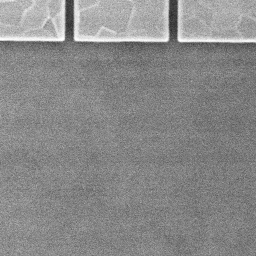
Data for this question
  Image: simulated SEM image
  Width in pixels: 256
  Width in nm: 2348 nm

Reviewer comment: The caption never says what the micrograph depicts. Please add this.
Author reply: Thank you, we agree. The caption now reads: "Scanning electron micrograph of wiring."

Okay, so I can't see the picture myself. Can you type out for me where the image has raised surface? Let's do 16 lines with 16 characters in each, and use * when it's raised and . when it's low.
****.***********
****.***********
****.*****.*****
................
................
................
................
................
................
................
................
................
................
................
................
................